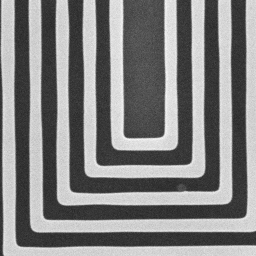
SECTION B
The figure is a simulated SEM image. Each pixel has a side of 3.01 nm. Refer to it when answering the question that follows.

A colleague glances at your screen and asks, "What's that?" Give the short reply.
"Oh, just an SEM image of groups of lines, slits or small figures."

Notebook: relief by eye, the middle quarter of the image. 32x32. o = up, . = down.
o....ooo....ooo..........ooo....
o....ooo....ooo...........oo....
o....ooo....ooo...........oo....
o....ooo....ooo...........oo....
o....ooo....ooo...........oo....
o....ooo....ooo...........oo....
o....ooo....ooo...........oo....
o....ooo....ooo...........oo....
o....ooo....ooo...........oo....
o....ooo....ooo..........ooo....
o....ooo....ooo..........ooo....
o....ooo....ooo..........ooo....
o....ooo....ooo..........ooo....
o....ooo....ooo..........ooo....
o....ooo....ooo..........ooo....
o....ooo....ooo..........ooo....
o....ooo....ooo..........ooo....
o....ooo....ooo..........ooo....
o....ooo....ooo.........oooo....
o....ooo....oooooooooooooooo....
o....ooo....oooooooooooooooo....
o....ooo.......oooooooooooo.....
o....ooo........................
o....ooo........................
o....ooo........................
o....ooooo..oooooooooooooooooooo
o....ooooooooooooooooooooooooooo
o....ooooooooooooooooooooooooooo
o...............................
o...............................
o...............................
oo..............................